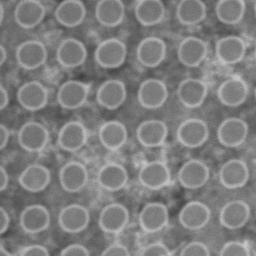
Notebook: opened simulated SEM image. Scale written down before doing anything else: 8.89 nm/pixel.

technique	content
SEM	a regular array of raised bodies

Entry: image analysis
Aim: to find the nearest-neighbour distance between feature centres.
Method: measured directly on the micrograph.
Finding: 349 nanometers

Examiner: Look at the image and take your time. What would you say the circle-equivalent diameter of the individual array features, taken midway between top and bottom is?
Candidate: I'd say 243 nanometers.